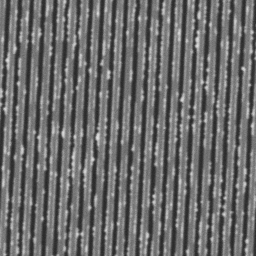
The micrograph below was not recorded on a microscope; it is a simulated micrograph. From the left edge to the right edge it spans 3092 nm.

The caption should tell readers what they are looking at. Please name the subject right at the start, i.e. parallel lines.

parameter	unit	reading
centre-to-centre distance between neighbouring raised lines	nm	142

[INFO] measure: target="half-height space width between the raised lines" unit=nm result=67.9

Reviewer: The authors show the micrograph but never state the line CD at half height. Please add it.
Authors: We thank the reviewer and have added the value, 79.9 nm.